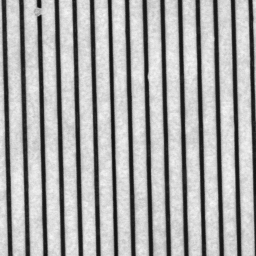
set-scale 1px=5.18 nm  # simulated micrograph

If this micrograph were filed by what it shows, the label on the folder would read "parallel lines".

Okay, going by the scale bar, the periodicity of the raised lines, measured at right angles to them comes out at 91.3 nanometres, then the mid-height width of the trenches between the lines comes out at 22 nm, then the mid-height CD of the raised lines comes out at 69.3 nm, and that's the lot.